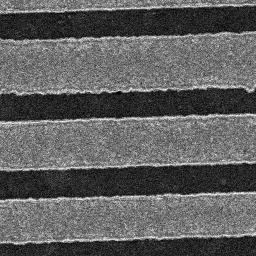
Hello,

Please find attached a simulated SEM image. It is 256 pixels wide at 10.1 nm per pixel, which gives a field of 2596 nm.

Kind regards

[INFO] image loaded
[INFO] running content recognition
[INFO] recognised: one or a few lines or trenches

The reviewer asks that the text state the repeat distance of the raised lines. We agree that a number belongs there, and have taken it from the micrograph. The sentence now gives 780 nm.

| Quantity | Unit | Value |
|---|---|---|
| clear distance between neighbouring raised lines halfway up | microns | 0.303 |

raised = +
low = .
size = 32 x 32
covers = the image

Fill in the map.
++++++++++++++++++++++++++++++++
++..............................
................................
................................
........................++++++++
++++++++++++++++++++++++++++++++
++++++++++++++++++++++++++++++++
++++++++++++++++++++++++++++++++
++++++++++++++++++++++++++++++++
++++++++++++++++++++++++++++++++
++++++++++++++++++++++++++++++++
..++++++........................
................................
................................
..........................++.+++
++++++++++++++++++++++++++++++++
++++++++++++++++++++++++++++++++
++++++++++++++++++++++++++++++++
++++++++++++++++++++++++++++++++
++++++++++++++++++++++++++++++++
+++++++++++++++++++++...........
................................
................................
................................
....................++++++++++++
++++++++++++++++++++++++++++++++
++++++++++++++++++++++++++++++++
++++++++++++++++++++++++++++++++
++++++++++++++++++++++++++++++++
++++++++++++++++++++++++...+....
................................
................................